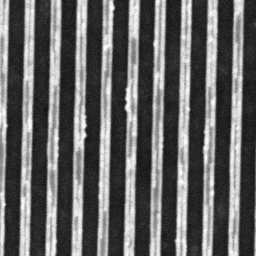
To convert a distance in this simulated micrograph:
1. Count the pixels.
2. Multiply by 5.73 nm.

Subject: parallel lines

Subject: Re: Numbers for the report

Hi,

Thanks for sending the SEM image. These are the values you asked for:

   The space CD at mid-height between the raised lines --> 101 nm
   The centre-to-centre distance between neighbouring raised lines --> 149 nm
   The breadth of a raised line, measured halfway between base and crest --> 0.0501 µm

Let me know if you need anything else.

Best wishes